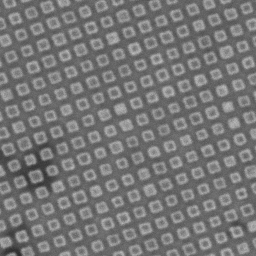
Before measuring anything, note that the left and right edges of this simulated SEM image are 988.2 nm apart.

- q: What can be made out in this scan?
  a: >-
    a regular array of raised bodies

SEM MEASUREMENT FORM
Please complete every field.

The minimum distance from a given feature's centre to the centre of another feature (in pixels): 16.9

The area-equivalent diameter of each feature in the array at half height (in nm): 40.1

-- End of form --